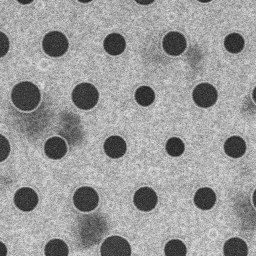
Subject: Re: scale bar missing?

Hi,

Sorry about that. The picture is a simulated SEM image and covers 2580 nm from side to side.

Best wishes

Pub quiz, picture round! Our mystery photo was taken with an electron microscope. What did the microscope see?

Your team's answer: a regular array of holes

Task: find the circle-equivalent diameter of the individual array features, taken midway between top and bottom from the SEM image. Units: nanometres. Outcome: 238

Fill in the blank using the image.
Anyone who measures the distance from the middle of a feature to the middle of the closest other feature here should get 599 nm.